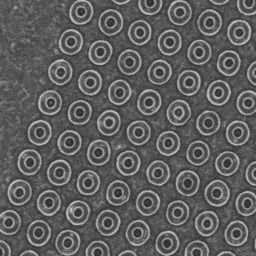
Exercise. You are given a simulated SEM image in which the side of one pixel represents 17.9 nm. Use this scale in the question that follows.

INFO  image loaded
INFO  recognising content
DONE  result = a regular array of ring-shaped raised bodies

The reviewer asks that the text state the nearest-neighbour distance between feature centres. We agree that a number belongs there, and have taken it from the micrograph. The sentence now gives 0.556 microns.